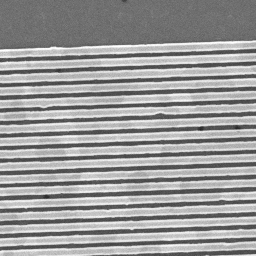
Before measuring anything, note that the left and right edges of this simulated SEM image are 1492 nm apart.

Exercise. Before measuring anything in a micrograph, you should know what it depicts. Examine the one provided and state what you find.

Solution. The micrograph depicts parallel lines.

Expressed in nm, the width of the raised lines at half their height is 42.9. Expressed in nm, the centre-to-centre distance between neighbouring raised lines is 73.1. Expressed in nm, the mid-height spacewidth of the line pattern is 32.